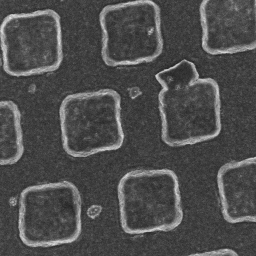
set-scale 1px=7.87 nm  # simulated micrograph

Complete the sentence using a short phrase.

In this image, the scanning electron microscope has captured raised bodies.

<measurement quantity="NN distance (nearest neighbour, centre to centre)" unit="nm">767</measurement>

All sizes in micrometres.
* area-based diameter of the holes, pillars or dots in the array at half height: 0.501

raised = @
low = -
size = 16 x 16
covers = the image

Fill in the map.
-------@@@---@@@
@@@@--@@@@---@@@
@@@@---@@@---@@@
@@@@---@@@------
-@--------@@----
----------@@@---
----@@@---@@@@--
@---@@@---@@@@--
@---@@@@--@@@---
@---@@----------
--------------@@
--------@@@---@@
-@@@@---@@@---@@
-@@@@---@@@---@@
-@@@@-----------
----------------